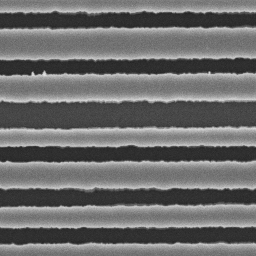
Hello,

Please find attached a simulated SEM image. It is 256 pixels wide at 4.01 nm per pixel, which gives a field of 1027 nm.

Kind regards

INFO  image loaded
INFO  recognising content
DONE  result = lines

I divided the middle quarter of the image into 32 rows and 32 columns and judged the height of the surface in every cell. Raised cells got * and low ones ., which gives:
................................
................................
*......*.....*.*.........***.***
********************************
********************************
********************************
********************************
********************************
********************************
................................
................................
................................
................................
................................
................................
................................
.*******************************
********************************
********************************
********************************
**************....*********.*.**
................................
................................
................................
...........**.***..***..*....**.
********************************
********************************
********************************
********************************
********************************
********************************
.....*..........................